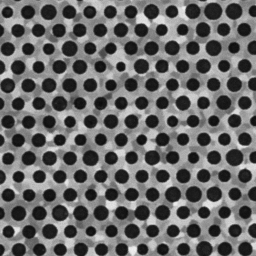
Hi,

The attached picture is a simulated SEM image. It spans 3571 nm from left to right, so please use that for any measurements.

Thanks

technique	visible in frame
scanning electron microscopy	a regular array of holes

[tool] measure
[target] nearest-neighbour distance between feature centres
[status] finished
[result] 0.284 um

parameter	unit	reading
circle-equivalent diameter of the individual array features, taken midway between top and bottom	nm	197